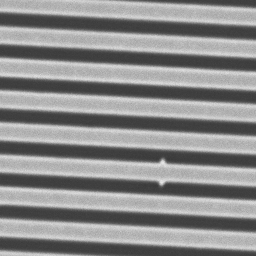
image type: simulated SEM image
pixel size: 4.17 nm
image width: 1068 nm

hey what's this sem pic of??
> parallel lines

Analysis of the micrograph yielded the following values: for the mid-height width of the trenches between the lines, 13.5 pixels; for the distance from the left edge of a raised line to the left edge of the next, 134 nm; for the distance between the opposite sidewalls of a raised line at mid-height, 77.6 nm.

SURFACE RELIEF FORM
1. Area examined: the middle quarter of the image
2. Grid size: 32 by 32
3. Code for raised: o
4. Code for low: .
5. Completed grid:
ooooooooooooooooooo.............
oooooooooooooooooooooooooooooooo
oooooooooooooooooooooooooooooooo
oooooooooooooooooooooooooooooooo
...........ooooooooooooooooooooo
.............................ooo
................................
................................
oooooooooooooooooo..............
oooooooooooooooooooooooooooooooo
oooooooooooooooooooooooooooooooo
oooooooooooooooooooooooooooooooo
..........oooooooooooooooooooooo
............................oooo
................................
................................
oooooooooooooooooo..............
oooooooooooooooooooooooooooooooo
oooooooooooooooooooooooooooooooo
oooooooooooooooooooooooooooooooo
..........oooooooooooooooooooooo
............................oooo
................................
................................
ooooooooooooooooo...o...o.......
oooooooooooooooooooooooooooooooo
oooooooooooooooooooooooooooooooo
oooooooooooooooooooooooooooooooo
.........ooooooooooooooooooooooo
.......................ooo.ooooo
................................
................................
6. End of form